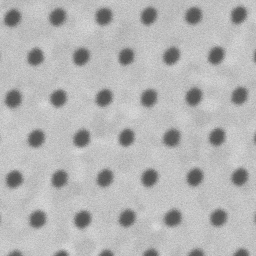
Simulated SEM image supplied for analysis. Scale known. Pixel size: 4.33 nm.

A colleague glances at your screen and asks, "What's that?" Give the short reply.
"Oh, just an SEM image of a regular array of holes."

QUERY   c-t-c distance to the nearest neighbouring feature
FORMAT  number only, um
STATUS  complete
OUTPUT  0.195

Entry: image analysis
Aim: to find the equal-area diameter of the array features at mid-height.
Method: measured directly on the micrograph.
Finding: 76.1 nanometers